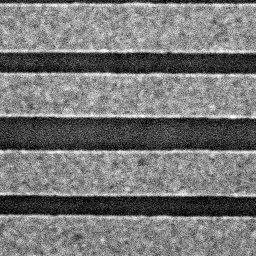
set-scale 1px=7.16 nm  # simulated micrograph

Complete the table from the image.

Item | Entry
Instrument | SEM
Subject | lines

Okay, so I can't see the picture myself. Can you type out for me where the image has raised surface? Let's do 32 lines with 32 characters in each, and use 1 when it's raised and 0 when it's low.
00000000000000000000000000000000
11111111111111111111111111111111
11111111111111111111111111111111
11111111111111111111111111111111
11111111111111111111111111111111
11111111111111111111111111111111
00000000000000000000000000000000
00000000000000000000000000000000
00000000000000000000000000000000
11111111111111111111111111111111
11111111111111111111111111111111
11111111111111111111111111111111
11111111111111111111111111111111
11111111111111111111111111111111
00000000000000000001111111111111
00000000000000000000000000000000
00000000000000000000000000000000
00000000000000000000000000000000
00000000000000000000000000000000
11111111111111111111111111111111
11111111111111111111111111111111
11111111111111111111111111111111
11111111111111111111111111111111
11111111111111111111111111111111
00000000000000000000000000000000
00000000000000000000000000000000
00000000000000000000000000000000
11111111111111111111111111111111
11111111111111111111111111111111
11111111111111111111111111111111
11111111111111111111111111111111
11111111111111111111111111111111